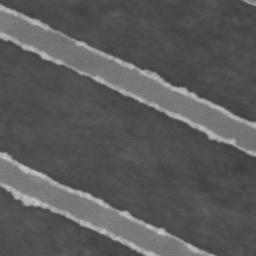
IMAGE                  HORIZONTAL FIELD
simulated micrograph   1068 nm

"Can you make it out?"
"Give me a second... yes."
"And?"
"one or a few lines or trenches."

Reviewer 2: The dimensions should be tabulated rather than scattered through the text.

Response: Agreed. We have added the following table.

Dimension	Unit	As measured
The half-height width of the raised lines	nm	123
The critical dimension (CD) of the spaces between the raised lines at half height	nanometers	447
